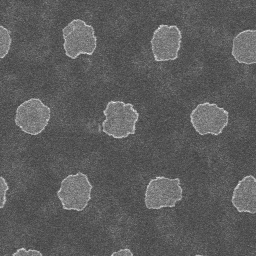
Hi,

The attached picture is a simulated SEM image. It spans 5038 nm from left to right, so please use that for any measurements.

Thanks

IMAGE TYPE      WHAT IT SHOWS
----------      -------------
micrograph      raised bodies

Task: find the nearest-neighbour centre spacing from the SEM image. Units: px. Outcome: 86.2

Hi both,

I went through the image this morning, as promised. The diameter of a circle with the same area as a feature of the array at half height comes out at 670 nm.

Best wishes